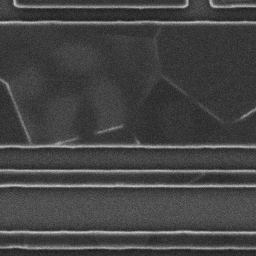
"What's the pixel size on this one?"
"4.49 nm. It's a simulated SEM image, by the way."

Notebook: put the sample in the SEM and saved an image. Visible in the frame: wiring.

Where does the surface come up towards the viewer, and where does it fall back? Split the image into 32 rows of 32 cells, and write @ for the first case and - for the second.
--@@@@@@@@@@@@@@@@@@@@@---@@@@@@
--------------------------------
--------------------------------
@@@@@@@@@@@@@@@@@@@@@@@@@@@@@@@@
@@@@@@@@@@@@@@@@@@@@@@@@@@@@@@@@
@@@@@@@@@@@@@@@@@@@@@@@@@@@@@@@@
@@@@@@@@@@@@@@@@@@@@@@@@@@@@@@@@
@@@@@@@@@@@@@@@@@@@@@@@@@@@@@@@@
@@@@@@@@@@@@@@@@@@@@@@@@@@@@@@@@
@@@@@@@@@@@@@@@@@@@@@@@@@@@@@@@@
@@@@@@@@@@@@@@@@@@@@@@@@@@@@@@@@
@@@@@@@@@@@@@@@@@@@@@@@@@@@@@@@@
@@@@@@@@@@@@@@@@@@@@@@@@@@@@@@@@
@@@@@@@@@@@@@@@@@@@@@@@@@@@@@@@@
@@@@@@@@@@@@@@@@@@@@@@@@@@@@@@@@
@@@@@@@@@@@@@@@@@@@@@@@@@@@@@@@@
@@@@@@@@@@@@@@@@@@@@@@@@@@@@@@@@
@@@@@@@@@@@@@@@@@@@@@@@@@@@@@@@@
--------------------------------
--------------------------------
--------------------------------
@@@@@@@@@@@@@@@@@@@@@@@@@@@@@@@@
@@@@@@@@@@@@@@@@@@@@@@@@@@@@@@@@
--------------------------------
--------------------------------
--------------------------------
--------------------------------
--------------------------------
--------------------------------
@@@@@@@@@@@@@@@@@@@@@@@@@@@@@@@@
@@@@@@@@@@@@@@@@@@@@@@@@@@@@@@@@
--------------------------------